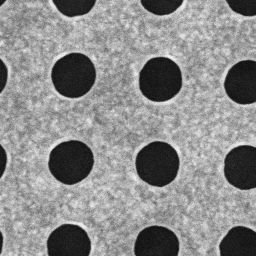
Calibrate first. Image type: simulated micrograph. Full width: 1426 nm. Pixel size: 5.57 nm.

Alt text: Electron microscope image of holes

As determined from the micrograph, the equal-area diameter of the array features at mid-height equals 249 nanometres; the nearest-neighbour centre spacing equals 477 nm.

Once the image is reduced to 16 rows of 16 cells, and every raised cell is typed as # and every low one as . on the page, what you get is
####..###..###..
################
################
####.###########
###...###..###..
###...###..###..
################
################
################
###...###..###..
###...###..###..
####.####..####.
################
################
###..####..###..
###...##...###..